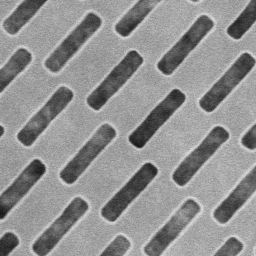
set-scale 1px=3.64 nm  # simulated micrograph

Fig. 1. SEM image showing a regular array of holes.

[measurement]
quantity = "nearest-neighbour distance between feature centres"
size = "206 nm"